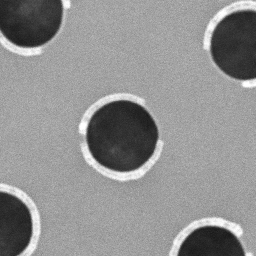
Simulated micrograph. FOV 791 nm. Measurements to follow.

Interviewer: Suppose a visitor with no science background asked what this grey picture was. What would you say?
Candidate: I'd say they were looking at holes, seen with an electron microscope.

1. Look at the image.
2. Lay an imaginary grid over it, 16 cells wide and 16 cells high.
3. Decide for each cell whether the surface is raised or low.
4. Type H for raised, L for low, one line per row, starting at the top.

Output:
LLLLHHHHHHHHHHHH
LLLLHHHHHHHHHHLL
HLLHHHHHHHHHHLLL
HHHHHHHHHHHHHLLL
HHHHHHHHHHHHHHLL
HHHHHHHHHHHHHHHH
HHHHHHHLLHHHHHHH
HHHHHHLLLLHHHHHH
HHHHHLLLLLHHHHHH
HHHHHHLLLLHHHHHH
HHHHHHHLLHHHHHHH
HHHHHHHHHHHHHHHH
LHHHHHHHHHHHHHHH
LLHHHHHHHHHHHHHH
LLHHHHHHHHHHLLHH
LLHHHHHHHHHLLLLH